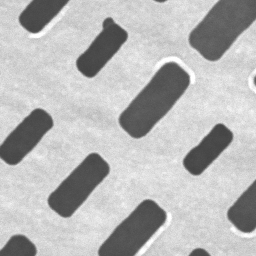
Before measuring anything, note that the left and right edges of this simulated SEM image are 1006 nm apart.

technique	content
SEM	holes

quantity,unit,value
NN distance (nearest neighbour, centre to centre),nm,288